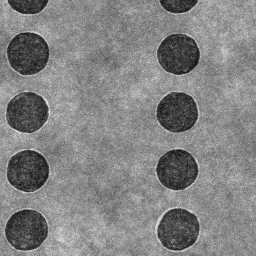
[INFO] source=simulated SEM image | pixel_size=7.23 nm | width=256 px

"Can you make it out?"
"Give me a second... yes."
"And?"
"a regular array of holes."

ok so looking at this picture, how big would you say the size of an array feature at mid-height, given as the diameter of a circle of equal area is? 0.308 microns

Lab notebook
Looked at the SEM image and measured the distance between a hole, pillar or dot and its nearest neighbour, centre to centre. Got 423 nanometres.